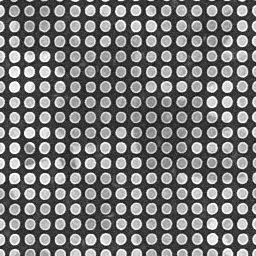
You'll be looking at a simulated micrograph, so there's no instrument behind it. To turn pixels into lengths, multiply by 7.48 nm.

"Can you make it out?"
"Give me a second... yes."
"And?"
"a regular array of raised bodies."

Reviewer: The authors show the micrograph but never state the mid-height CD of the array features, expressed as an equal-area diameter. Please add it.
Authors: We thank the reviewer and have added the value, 0.0791 um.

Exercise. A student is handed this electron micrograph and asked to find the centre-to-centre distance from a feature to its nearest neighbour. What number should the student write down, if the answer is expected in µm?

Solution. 0.112